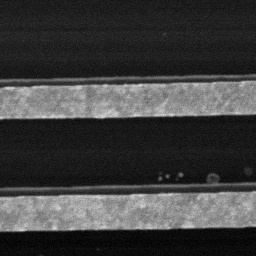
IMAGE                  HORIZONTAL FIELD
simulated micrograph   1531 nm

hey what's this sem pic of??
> lines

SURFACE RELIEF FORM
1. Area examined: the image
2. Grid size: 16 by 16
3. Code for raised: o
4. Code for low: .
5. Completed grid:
................
................
................
................
................
oooooooooooooooo
oooooooooooooooo
................
................
................
................
.............ooo
oooooooooooooooo
oooooooooooooooo
................
................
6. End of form